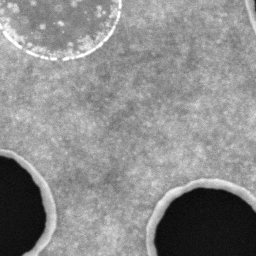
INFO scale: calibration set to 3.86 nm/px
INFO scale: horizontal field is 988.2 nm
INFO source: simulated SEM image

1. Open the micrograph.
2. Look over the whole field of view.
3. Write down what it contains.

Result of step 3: holes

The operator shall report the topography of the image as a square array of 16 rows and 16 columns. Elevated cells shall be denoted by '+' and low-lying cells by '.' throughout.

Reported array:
++++++++++++++++
++++++++++++++++
++++++++++++++++
++++++++++++++++
++++++++++++++++
++++++++++++++++
++++++++++++++++
++++++++++++++++
++++++++++++++++
++++++++++++++++
..++++++++++++++
...+++++++++.+++
...++++++++.....
...+++++++......
...++++++.......
..+++++++.......